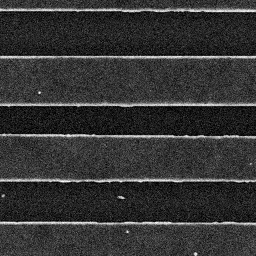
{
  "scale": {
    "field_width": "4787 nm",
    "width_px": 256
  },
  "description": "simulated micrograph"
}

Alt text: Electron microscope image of lines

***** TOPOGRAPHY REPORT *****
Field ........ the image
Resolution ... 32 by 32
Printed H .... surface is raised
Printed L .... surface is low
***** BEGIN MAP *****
HHHHHHHHHHHHHHHHHHHHHHHHHHHHHHHH
LLLLLLLLLLLLLLLLLLLLLLLLLLLLLLLL
LLLLLLLLLLLLLLLLLLLLLLLLLLLLLLLL
LLLLLLLLLLLLLLLLLLLLLLLLLLLLLLLL
LLLLLLLLLLLLLLLLLLLLLLLLLLLLLLLL
LLLLLLLLLLLLLLLLLLLLLLLLLLLLLLLL
LLLLLLLLLLLLLLLLLLLLLLLLLLLLLLLL
HHHHHHHHHHHHHHHHHHHHHHHHHHHHHHHH
HHHHHHHHHHHHHHHHHHHHHHHHHHHHHHHH
HHHHHHHHHHHHHHHHHHHHHHHHHHHHHHHH
HHHHHHHHHHHHHHHHHHHHHHHHHHHHHHHH
HHHHHHHHHHHHHHHHHHHHHHHHHHHHHHHH
HHHHHHHHHHHHHHHHHHHHHHHHHHHHHHHH
LLLLLLLLLLLLLLLLLLLLLLLLLLLLLLLL
LLLLLLLLLLLLLLLLLLLLLLLLLLLLLLLL
LLLLLLLLLLLLLLLLLLLLLLLLLLLLLLLL
LLLLLLLLLLLLLLLLLLLLLLLLLLLLLLLL
HHHHHHHHHHHHHHHHHHHHHHHHHHHHHHHH
HHHHHHHHHHHHHHHHHHHHHHHHHHHHHHHH
HHHHHHHHHHHHHHHHHHHHHHHHHHHHHHHH
HHHHHHHHHHHHHHHHHHHHHHHHHHHHHHHH
HHHHHHHHHHHHHHHHHHHHHHHHHHHHHHHH
HHHHHHHHHHHHHHHHHHHHHHHHHHHHHHHH
LLLLLLLLLLLLLLLLLLLLLLLLLLLLLLLL
LLLLLLLLLLLLLLLLLLLLLLLLLLLLLLLL
LLLLLLLLLLLLLLLLLLLLLLLLLLLLLLLL
LLLLLLLLLLLLLLLLLLLLLLLLLLLLLLLL
LLLLLLLLLLLLLLLLLLLLLLLLLLLLLLLL
HHHHHHHHHHHHHHHHHHHHHHHHHHHHHHHH
HHHHHHHHHHHHHHHHHHHHHHHHHHHHHHHH
HHHHHHHHHHHHHHHHHHHHHHHHHHHHHHHH
HHHHHHHHHHHHHHHHHHHHHHHHHHHHHHHH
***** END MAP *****